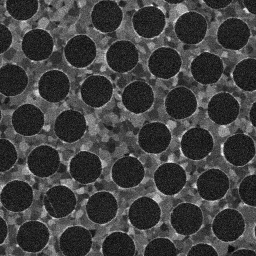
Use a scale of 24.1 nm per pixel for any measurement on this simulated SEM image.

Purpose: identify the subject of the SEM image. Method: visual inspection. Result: a regular array of holes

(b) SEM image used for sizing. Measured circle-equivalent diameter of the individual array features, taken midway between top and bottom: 797 nm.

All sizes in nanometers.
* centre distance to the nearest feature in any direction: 1020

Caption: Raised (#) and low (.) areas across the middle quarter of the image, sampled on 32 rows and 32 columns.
##....#####.......###........###
############.....####........###
######################......####
.#####.....#############...#####
.####.......#####...############
..##........####......##########
.###........###.......#####.....
.###........##.........###......
####........##.........##.......
#####......####.......###.......
######....#####.......###.......
#..#############.....####.......
.....#############.#######......
.....######################....#
......#################.########
......##############......######
.....##############.......#####.
.....##############........###..
....##############.........##...
...###############.........##...
###################.......###...
####################.....####...
###.....######################..
##.......#####....#############.
##.......####......#############
#.........##........####.....###
#.........##........###.......##
##.......###........##.........#
##.......###........##.........#
###.....#####......####........#
##############....#####.......##
..######################.....###